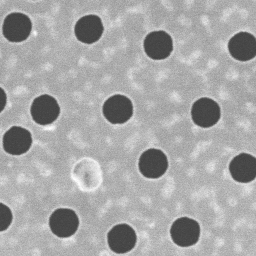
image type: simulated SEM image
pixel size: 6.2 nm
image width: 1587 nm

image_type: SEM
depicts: a regular array of holes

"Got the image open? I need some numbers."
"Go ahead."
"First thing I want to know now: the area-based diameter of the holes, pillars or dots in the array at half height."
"190 nanometres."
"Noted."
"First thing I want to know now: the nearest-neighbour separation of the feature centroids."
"401 nanometres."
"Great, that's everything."